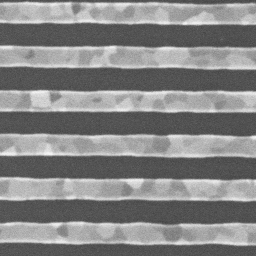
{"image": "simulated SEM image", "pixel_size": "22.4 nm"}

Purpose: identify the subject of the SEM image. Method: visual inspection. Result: wiring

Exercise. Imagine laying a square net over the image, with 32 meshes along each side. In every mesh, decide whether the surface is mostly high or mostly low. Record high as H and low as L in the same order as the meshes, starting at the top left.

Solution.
HHHHHLHHHHHHLLLLLLHHLLLLLLLLLLLL
HHHHHHHHHHHHHHHHHHHHHHHHHHHHHHHH
HHHHHHHHHHHHHHHHHHHHHHHHHHHHHHHH
LLLLLLLLLLLLLLLLLLLLLLLLLLLLLLLL
LLLLLLLLLLLLLLLLLLLLLLLLLLLLLLLL
LLLLLLLLLLLLLLLLLLLLLLLLLLLLLLLL
HHHHHHHHHHHHHHHHHHHHHHHHHHHHHHHH
HHHHHHHHHHHHHHHHHHHHHHHHHHHHHHHH
LLLLLLLLLLLLLLLLLLLLLLLLHHHHHHHH
LLLLLLLLLLLLLLLLLLLLLLLLLLLLLLLL
LLLLLLLLLLLLLLLLLLLLLLLLLLLLLLLL
HHHLHHHHLLLLLLLLLLLLLLLLLLLLLLLL
HHHHHHHHHHHHHHHHHHHHHHHHHHHHHHHH
HHHHHHHHHHHHHHHHHHHHHHHHHHHHHHHH
LLLLLLLLLLLLLLLLLLLLLLLLLLLLLLLL
LLLLLLLLLLLLLLLLLLLLLLLLLLLLLLLL
LLLLLLLLLLLLLLLLLLLLLLLLLLLLLLLL
HHHHHHHHHHHHHHHHHHHHHHHHHHHHHHHH
HHHHHHHHHHHHHHHHHHHHHHHHHHHHHHHH
LLLLLLLLLLLLLLLLLLLHHHHHHHHLLLHH
LLLLLLLLLLLLLLLLLLLLLLLLLLLLLLLL
LLLLLLLLLLLLLLLLLLLLLLLLLLLLLLLL
HHHHHLHHHLLLLLLLLLLLLLLLLLLLLLLL
HHHHHHHHHHHHHHHHHHHHHHHHHHHHHHHH
HHHHHHHHHHHHHHHHHHHHHHHHHHHHHHHH
LLLLLLLLLLLLLLLLLLLLLLLLLLLLLLLL
LLLLLLLLLLLLLLLLLLLLLLLLLLLLLLLL
LLLLLLLLLLLLLLLLLLLLLLLLLLLLLLLL
HHHHHHHHHHHHHHHHHHHHHHHHHHHHHHHH
HHHHHHHHHHHHHHHHHHHHHHHHHHHHHHHH
LLLLLLLLLLLLLLLLLHHHLHHHHLLLHHHH
LLLLLLLLLLLLLLLLLLLLLLLLLLLLLLLL